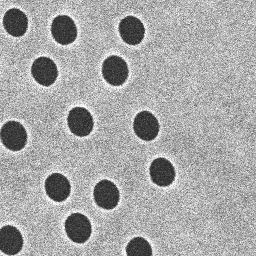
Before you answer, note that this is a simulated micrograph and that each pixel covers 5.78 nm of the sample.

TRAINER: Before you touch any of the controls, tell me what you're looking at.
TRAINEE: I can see a regular array of holes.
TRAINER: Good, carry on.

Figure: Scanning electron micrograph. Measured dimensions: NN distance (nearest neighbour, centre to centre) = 0.265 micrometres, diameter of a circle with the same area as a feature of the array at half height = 162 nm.